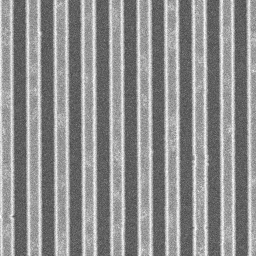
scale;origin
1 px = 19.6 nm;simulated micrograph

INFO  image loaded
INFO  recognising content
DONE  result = parallel lines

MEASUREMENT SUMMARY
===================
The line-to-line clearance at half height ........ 290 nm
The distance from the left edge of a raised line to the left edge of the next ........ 543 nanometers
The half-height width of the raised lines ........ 253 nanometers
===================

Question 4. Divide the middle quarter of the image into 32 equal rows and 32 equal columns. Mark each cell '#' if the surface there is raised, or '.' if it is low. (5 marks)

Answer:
#....###....###....###....###...
#....###....###....###....###...
#....###....###....###....###...
#....###....###....###....###...
#....###....###....###....##....
#....###....###....###....###...
#....###....###....###....###...
#....###....###....###....###...
#....###....###....###....###...
#....###....###....###....###...
#....###....###....###....###...
#....###....###....###....###...
#....###....###....###....###...
#....###....###....###....###...
#....###....###....###....###...
#....###....###....###....###...
#....###....###....###....###...
#....###....###....###...####...
#....###....###....###...####...
#....###....###....###....###...
#....###....###....###....##....
#....###....###....###....###...
#....###....###....###....###...
#....###....###....###....###...
#....###....###....###....###...
#....###....###....###....###...
#....###....###....###....###...
#....###....###....###....###...
#....###....###....###....###...
#....###....###....###....###...
#....###....###....###....###...
#....###....###....###....###...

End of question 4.